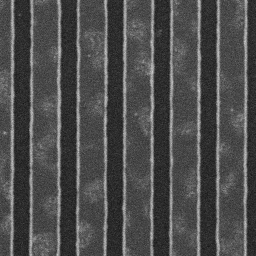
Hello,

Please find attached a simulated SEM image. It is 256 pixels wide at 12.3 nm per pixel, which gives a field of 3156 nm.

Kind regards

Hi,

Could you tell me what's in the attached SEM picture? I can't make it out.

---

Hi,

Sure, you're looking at parallel lines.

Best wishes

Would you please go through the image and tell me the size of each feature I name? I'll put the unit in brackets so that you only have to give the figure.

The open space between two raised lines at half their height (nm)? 225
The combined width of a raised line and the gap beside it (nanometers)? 576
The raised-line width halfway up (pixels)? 27.9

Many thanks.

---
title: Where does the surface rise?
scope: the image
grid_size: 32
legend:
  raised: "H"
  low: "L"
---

HLLLHHHLLLHHHLLLHHHLLHHHHLLHHHHL
HHLLHHHLLLHHHLLLHHHLLHHHHLLHHHHL
HLLLHHHLLLHHHLLLHHHLLHHHHLLHHHHL
HHLLHHHLLLHHHLLLHHHLLHHHHLLHHHHL
HHLLHHHLLLHHHLLLHHHLLHHHHLLHHHHL
HHLLHHHLLLHHHLLLHHHLLHHHHLLHHHHL
HHLLHHHLLLHHHLLLHHHLLHHHHLLHHHHL
HHLLHHHLLLHHHLLLHHHLLHHHHLLHHHHL
HHLLHHHLLLHHHLLLHHHLLHHHHLLHHHHL
HLLLHHHLLLHHHLLLHHHLLHHHHLLHHHHL
HLLLHHHLLLHHHLLLHHHLLHHHHLLHHHHL
HHLLHHHLLLHHHLLLHHHLLHHHHLLHHHHL
HHLLHHHLLLHHHLLLHHHLLHHHHLLHHHHL
HLLLHHHLLLHHHLLLHHHLLHHHHLLHHHHL
HLLLHHHLLLHHHLLLHHHLLHHHHLLHHHHL
HHLLHHHLLLHHHLLLHHHLLHHHHLLHHHHL
HHLLHHHLLLHHHLLLHHHLLHHHHLLHHHHL
HHLLHHHLLLHHHLLLHHHLLHHHHLLHHHHL
HHLLHHHLLLHHHLLLHHHLLHHHHLLHHHHL
HHLLHHHLLLHHHLLLHHHLLHHHHLLHHHHL
HHLLHHHLLLHHHLLLHHHLLHHHHLLHHHHL
HHLLHHHLLLHHHLLHHHHLLHHHHLLHHHHL
HHLLHHHLLLHHHLLLHHHLLHHHHLLHHHHL
HLLLHHHLLLHHHLLLHHHLLHHHHLLHHHHL
HHLLHHHLLLHHHLLLHHHLLHHHHLLHHHHL
HLLLHHHLLLHHHLLHHHHLLHHHHLLHHHHL
HHLLHHHLLLHHHLLHHHHLLHHHHLLHHHHL
HHLLHHHLLLHHHLLLHHHLLHHHHLLHHHHL
HHLLHHHLLLHHHLLHHHHLLHHHHLLHHHHL
HHLLHHHLLLHHHLLHHHHLLHHHHLLHHHHL
HLLLHHHLLLHHHLLHHHHLLHHHHLLHHHHL
HLLLHHHLLLHHHLLHHHHLLHHHHLLHHHHL